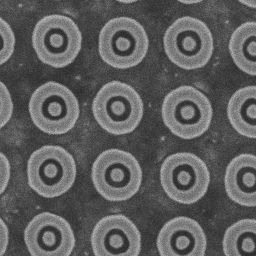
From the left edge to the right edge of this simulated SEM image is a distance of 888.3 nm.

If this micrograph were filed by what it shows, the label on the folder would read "a regular array of ring-shaped raised bodies with a dot in the middle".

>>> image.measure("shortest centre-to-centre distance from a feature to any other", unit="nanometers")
227